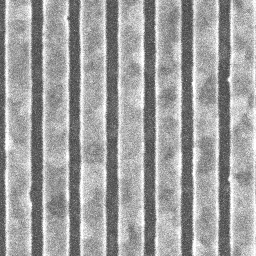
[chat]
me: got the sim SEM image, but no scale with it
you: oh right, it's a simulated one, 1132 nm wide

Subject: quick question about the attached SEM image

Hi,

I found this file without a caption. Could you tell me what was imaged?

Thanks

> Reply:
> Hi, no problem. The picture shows parallel lines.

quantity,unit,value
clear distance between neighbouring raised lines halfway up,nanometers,60.7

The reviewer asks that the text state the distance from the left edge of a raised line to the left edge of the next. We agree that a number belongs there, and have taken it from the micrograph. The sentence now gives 166 nm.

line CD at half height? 107 nm